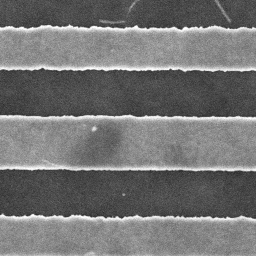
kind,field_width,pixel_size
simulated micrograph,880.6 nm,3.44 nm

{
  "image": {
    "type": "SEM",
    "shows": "lines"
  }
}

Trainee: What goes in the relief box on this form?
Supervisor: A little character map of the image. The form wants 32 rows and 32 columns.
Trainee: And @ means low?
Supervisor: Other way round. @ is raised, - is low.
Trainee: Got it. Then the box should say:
--------------------------------
--------------------------------
--------------------------------
@@@-@@@@@@@@@@--@@---@-@@@@@--@-
@@@@@@@@@@@@@@@@@@@@@@@@@@@@@@@@
@@@@@@@@@@@@@@@@@@@@@@@@@@@@@@@@
@@@@@@@@@@@@@@@@@@@@@@@@@@@@@@@@
@@@@@@@@@@@@@@@@@@@@@@@@@@@@@@@@
@@@@@@@@@@@@@@@@@@@@@@@@@@@@@@@@
--------------------------------
--------------------------------
--------------------------------
--------------------------------
--------------------------------
@@@-----@-@@@@-@@--@------------
@@@@@@@@@@@@@@@@@@@@@@@@@@@@@@@@
@@@@@@@@@@@@@@@@@@@@@@@@@@@@@@@@
@@@@@@@@@@@@@@@@@@@@@@@@@@@@@@@@
@@@@@@@@@@@@@@@@@@@@@@@@@@@@@@@@
@@@@@@@@@@@@@@@@@@@@@@@@@@@@@@@@
@@@@@@@@@@@@@@@@@@@@@@@@@@@@@@@@
--------------------------------
--------------------------------
--------------------------------
--------------------------------
--------------------------------
--------------------------------
@@@@@@@@@@@@@@@@@@@@@@@@@@@@@@@@
@@@@@@@@@@@@@@@@@@@@@@@@@@@@@@@@
@@@@@@@@@@@@@@@@@@@@@@@@@@@@@@@@
@@@@@@@@@@@@@@@@@@@@@@@@@@@@@@@@
@@@@@@@@@@@@@@@@@@@@@@@@@@@@@@@@